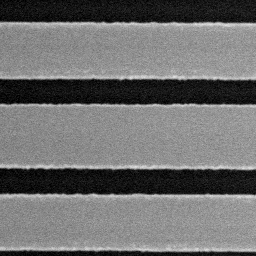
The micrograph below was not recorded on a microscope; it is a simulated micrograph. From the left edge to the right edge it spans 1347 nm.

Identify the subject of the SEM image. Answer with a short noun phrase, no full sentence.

lines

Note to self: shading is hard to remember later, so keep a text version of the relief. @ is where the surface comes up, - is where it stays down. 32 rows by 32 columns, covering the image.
--------------------------------
--------------------------------
--------------------------------
@@@@@@@@@@@@@@@@@@@@@@@@@@@@@@@@
@@@@@@@@@@@@@@@@@@@@@@@@@@@@@@@@
@@@@@@@@@@@@@@@@@@@@@@@@@@@@@@@@
@@@@@@@@@@@@@@@@@@@@@@@@@@@@@@@@
@@@@@@@@@@@@@@@@@@@@@@@@@@@@@@@@
@@@@@@@@@@@@@@@@@@@@@@@@@@@@@@@@
@@@@@@@@@@@@@@@@@@@@@@@@@@@@@@@@
--------------------------------
--------------------------------
--------------------------------
@@@@@@@@@@@@@@@@@@@@@@@@@@@@@@@@
@@@@@@@@@@@@@@@@@@@@@@@@@@@@@@@@
@@@@@@@@@@@@@@@@@@@@@@@@@@@@@@@@
@@@@@@@@@@@@@@@@@@@@@@@@@@@@@@@@
@@@@@@@@@@@@@@@@@@@@@@@@@@@@@@@@
@@@@@@@@@@@@@@@@@@@@@@@@@@@@@@@@
@@@@@@@@@@@@@@@@@@@@@@@@@@@@@@@@
@@@@@@@@@@@@@@@@@@@@@@@@@@@@@@@@
--------------------------------
--------------------------------
--------------------------------
@@@@@@@@@@@@@@@@@@@@@@@@@@@@@@@@
@@@@@@@@@@@@@@@@@@@@@@@@@@@@@@@@
@@@@@@@@@@@@@@@@@@@@@@@@@@@@@@@@
@@@@@@@@@@@@@@@@@@@@@@@@@@@@@@@@
@@@@@@@@@@@@@@@@@@@@@@@@@@@@@@@@
@@@@@@@@@@@@@@@@@@@@@@@@@@@@@@@@
@@@@@@@@@@@@@@@@@@@@@@@@@@@@@@@@
--------------------------------